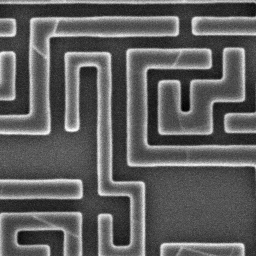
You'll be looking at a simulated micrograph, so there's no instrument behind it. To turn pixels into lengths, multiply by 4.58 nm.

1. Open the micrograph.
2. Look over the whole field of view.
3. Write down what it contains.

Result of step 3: wiring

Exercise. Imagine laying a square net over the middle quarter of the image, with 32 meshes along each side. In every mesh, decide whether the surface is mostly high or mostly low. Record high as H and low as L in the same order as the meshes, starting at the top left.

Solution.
LHHHLLLLHHHLLLLLHHHHHHHHHHHHHHHH
LHHHLLLLLHHLLLLLHHHHHLLLLLLLLLLL
LHHHLLLLLHHHLLLLHHHHLLLLLLLLLLLL
LHHHLLLLLHHHLLLLHHHHLLLLLLLLLLLL
LHHHLLLLLHHHLLLLHHHHLLLLHHHHHLLL
LHHLLLLLLHHHLLLLHHHHLLLLHHHHHLLL
LHHLLLLLLHHHLLLLHHHHLLLLHHHHHLLL
LHHLLLLLLHHHLLLLHHHHHLLLHHHHHLLL
LHHLLLLLLHHLLLLLHHHHHLLLHHHHHLLL
LHHLLLLLLHHLLLLLHHHHHLLLHHHHHLLL
LHHLLLLLLHHLLLLLHHHHHLLLHHHHHLLL
LHHLLLLLLHHLLLLLHHHHHLLLHHHHHLLH
LHHLLLLLLHHLLLLLHHHHHLLLHHHHHHHH
LHHHLLLLLHHLLLLLHHHHHLLLHHHHHHHH
LHHHLLLLLHHHLLLLHHHHHLLLHHHHHHHH
LHHHLLLLLHHHLLLLHHHHHLLLHHHHHHHH
LHHLLLLLLHHHLLLLHHHHHLLLHHHHHHHH
LLLLLLLLLHHHLLLLHHHHHLLLLLLLLLLL
LLLLLLLLLHHHLLLLHHHHHLLLLLLLLLLL
LLLLLLLLLHHHLLLLHHHHHLLLLLLLLLLL
LLLLLLLLLHHHLLLLHHHHHHLLLLLLLLLL
LLLLLLLLLHHHLLLLHHHHHHHHHHHHHHHH
LLLLLLLLLHHHLLLLHHHHHHHHHHHHHHHH
LLLLLLLLLHHHLLLLHHHHHHHHHHHHHHHH
LLLLLLLLLHHHLLLLHHHHHHHHHHHHHHHH
LLLLLLLLLHHHLLLLLLLLLLLLLLLLLLLL
LLLLLLLLLHHHLLLLLLLLLLLLLLLLLLLL
LLLLLLLLLHHHLLLLLLLLLLLLLLLLLLLL
LLLLLLLLLHHHLLLLLLLLLLLLLLLLLLLL
HHHHLLLLLHHHHLLLLLLLLLLLLLLLLLLL
HHHHLLLLLHHHHHHHHHHHLLLLLLLLLLLL
HHHHLLLLLHHHHHHHHHHHLLLLLLLLLLLL